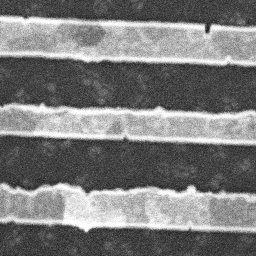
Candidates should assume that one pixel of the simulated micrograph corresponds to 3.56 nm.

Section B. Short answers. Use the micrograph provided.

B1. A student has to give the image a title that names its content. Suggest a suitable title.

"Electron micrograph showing one or a few lines or trenches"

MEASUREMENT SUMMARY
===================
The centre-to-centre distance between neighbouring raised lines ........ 297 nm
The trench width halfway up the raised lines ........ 193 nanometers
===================